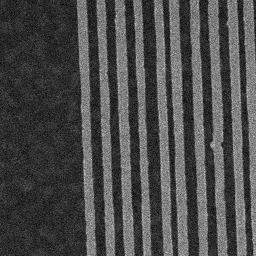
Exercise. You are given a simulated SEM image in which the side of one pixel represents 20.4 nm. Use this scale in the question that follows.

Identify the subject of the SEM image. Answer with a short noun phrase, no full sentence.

parallel lines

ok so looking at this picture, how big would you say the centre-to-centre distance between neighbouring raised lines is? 382 nanometres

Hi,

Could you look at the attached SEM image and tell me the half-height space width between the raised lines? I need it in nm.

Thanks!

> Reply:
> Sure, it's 209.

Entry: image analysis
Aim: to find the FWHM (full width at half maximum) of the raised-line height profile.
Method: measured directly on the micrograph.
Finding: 0.166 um